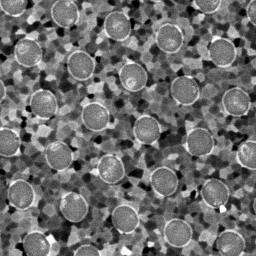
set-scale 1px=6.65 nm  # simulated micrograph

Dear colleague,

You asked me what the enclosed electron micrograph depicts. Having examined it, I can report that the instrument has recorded a regular array of holes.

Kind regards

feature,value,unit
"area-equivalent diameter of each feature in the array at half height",26.9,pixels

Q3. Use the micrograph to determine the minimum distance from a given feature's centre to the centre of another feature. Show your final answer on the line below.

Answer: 352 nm